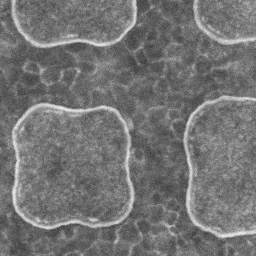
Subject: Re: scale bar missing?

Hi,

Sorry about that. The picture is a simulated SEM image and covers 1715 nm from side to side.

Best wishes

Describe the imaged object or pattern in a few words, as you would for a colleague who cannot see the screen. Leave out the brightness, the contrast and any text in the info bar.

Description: raised bodies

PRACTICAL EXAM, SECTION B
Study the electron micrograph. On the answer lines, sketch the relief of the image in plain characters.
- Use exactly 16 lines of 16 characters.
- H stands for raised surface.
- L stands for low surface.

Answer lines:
LHHHHHHHLLLLHHHH
LHHHHHHHLLLLHHHH
LLHHHHHLLLLLLLHL
LLLLLLLLLLLLLLLL
LLLLLLLLLLLLLLLL
LLLLLLLLLLLLLLLL
LLLLLLLLLLLLLHHH
LHHHHHHHLLLLHHHH
LHHHHHHHLLLLHHHH
LHHHHHHHLLLLHHHH
LHHHHHHHLLLLHHHH
LHHHHHHHLLLLHHHH
LHHHHHHHLLLLHHHH
LHHHHHHHLLLLHHHH
LLLLLLLLLLLLLHHH
LLLLLLLLLLLLLLLL